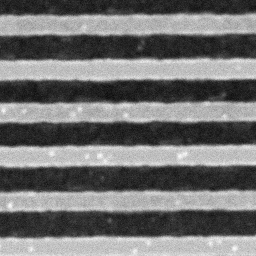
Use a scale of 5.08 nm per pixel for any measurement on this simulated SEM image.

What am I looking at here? lines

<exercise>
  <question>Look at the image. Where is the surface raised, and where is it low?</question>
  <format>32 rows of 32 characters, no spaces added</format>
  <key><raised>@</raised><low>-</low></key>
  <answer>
--------------------------------
--------------------------------
@@@@@@@@@@@@@@@@@@@@@@@@@@@@@@@@
@@@@@@@@@@@@@@@@@@@@@@@@@@@@@@@@
--------------------------------
--------------------------------
--------------------------------
-------------@--------@-@@-@-@@@
@@@@@@@@@@@@@@@@@@@@@@@@@@@@@@@@
@@@@@@@@@@@@@@@@@@@@@@@@@@@@@@@@
--------------------------------
--------------------------------
--------------------------------
@@@@@@@@@@@@@@@@@@@@@@@@@@@@@@@@
@@@@@@@@@@@@@@@@@@@@@@@@@@@@@@@@
--------------------------------
--------------------------------
--------------------------------
@-@@@@@@@@@@@@@@@@@@@@@@@@@@@@@@
@@@@@@@@@@@@@@@@@@@@@@@@@@@@@@@@
@@@@@@@@@@@@@@@@@@@@@@@@@@@@@@@@
--------------------------------
--------------------------------
--------------------------------
@@@@@@@@@@@@@@@@@@@@@@@@@@@@@@@@
@@@@@@@@@@@@@@@@@@@@@@@@@@@@@@@@
--------------------------------
--------------------------------
--------------------------------
--------------------------------
@@@@@@@@@@@@@@@@@@@@@@@@@@@@@@@@
@@@@@@@@@@@@@@@@@@@@@@@@@@@@@@@@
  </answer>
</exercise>